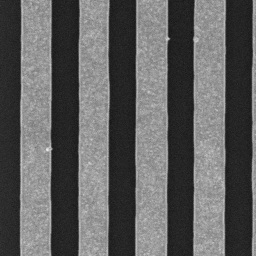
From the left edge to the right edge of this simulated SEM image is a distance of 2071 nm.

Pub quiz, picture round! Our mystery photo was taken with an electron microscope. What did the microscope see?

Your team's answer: wiring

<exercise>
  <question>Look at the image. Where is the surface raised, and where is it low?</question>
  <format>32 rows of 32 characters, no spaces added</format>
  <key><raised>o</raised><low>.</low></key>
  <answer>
...ooo....oooo...oooo...oooo....
...ooo....oooo...oooo...oooo....
...ooo....ooo....oooo...oooo....
...ooo....ooo....oooo...oooo....
...ooo....ooo....oooo...oooo....
...ooo....ooo....oooo...oooo....
...ooo....ooo....oooo...oooo....
...ooo....ooo....oooo...oooo....
...ooo....ooo....oooo...oooo....
...ooo....oooo...oooo...oooo....
...ooo....oooo...oooo...oooo....
...ooo....oooo...oooo...oooo....
...ooo....oooo...oooo...oooo....
...ooo....oooo...oooo...oooo....
...ooo....oooo...oooo...oooo....
...ooo....ooo....oooo...oooo....
...ooo....ooo....oooo...oooo....
...ooo....ooo....oooo...oooo....
...ooo....ooo....oooo...oooo....
...ooo....ooo....oooo...oooo....
...ooo....ooo....oooo...oooo....
...ooo....ooo....oooo...oooo....
...ooo....ooo....oooo...oooo....
...ooo....ooo....oooo...oooo....
...ooo....ooo....oooo...oooo....
...ooo....ooo....oooo...oooo....
...ooo....ooo....oooo...oooo....
...ooo....ooo....oooo...oooo....
...ooo....ooo....oooo...oooo....
...ooo....ooo....oooo...oooo....
...ooo....ooo....oooo...oooo....
...ooo....ooo....oooo...oooo....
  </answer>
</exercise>